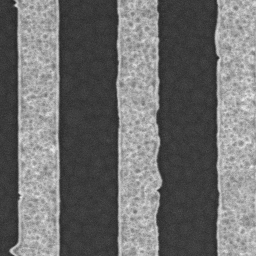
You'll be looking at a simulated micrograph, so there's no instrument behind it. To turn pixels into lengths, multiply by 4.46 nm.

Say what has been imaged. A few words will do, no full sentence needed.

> one or a few lines or trenches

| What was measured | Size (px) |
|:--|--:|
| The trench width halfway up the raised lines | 61.2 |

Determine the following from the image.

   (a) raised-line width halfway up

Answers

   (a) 161 nanometres